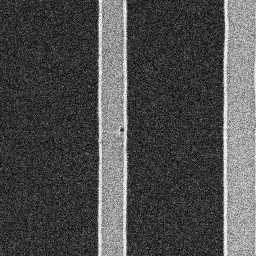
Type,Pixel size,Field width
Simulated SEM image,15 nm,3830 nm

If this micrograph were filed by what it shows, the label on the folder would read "one or a few lines or trenches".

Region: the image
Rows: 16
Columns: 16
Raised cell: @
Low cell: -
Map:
@@@@@@--@@@@@@--
@@@@@@--@@@@@@--
@@@@@@--@@@@@@--
@@@@@@--@@@@@@--
@@@@@@--@@@@@@--
@@@@@@--@@@@@@--
@@@@@@--@@@@@@--
@@@@@@--@@@@@@--
@@@@@@--@@@@@@--
@@@@@@--@@@@@@--
@@@@@@--@@@@@@--
@@@@@@--@@@@@@--
@@@@@@--@@@@@@--
@@@@@@--@@@@@@--
@@@@@@--@@@@@@--
@@@@@@--@@@@@@--